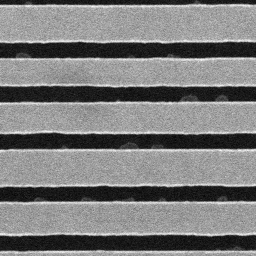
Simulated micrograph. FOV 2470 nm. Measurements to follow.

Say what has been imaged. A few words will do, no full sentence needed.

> lines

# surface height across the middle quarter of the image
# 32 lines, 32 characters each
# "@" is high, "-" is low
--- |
@@@@@@@@@@@@@@@@@@@@@@@@@@@@@@@@
@@@@@@@@@@@@@@@@@@@@@@@@@@@@@@@@
@@@@@@@@@@@@@@@@@@@@@@@@@@@@@@@@
@@@@@@@@@@@@@@@@@@@@@@@@@@@@@@@@
@@@@@@@@@@@@@@@@@@@@@@@@@@@@@@@@
------------@@-@----@--------@@-
--------------------------------
--------------------------------
--------------------------------
--------------------------------
@@@@@@@@@@@@@@@@@@@@@@@@@@@@@@@@
@@@@@@@@@@@@@@@@@@@@@@@@@@@@@@@@
@@@@@@@@@@@@@@@@@@@@@@@@@@@@@@@@
@@@@@@@@@@@@@@@@@@@@@@@@@@@@@@@@
@@@@@@@@@@@@@@@@@@@@@@@@@@@@@@@@
@@@@@@@@@@@@@@@@@@@@@@@@@@@@@@@@
@@@@@@@@@@@@@@@@@@@@@@@@@@@@@@@@
-----@------@-----@-----------@-
--------------------------------
--------------------------------
--------------------------------
@@@@@@@@@@@@@@@@@@@@@@@@@@@@@@@@
@@@@@@@@@@@@@@@@@@@@@@@@@@@@@@@@
@@@@@@@@@@@@@@@@@@@@@@@@@@@@@@@@
@@@@@@@@@@@@@@@@@@@@@@@@@@@@@@@@
@@@@@@@@@@@@@@@@@@@@@@@@@@@@@@@@
@@@@@@@@@@@@@@@@@@@@@@@@@@@@@@@@
@@@@@@@@@@@@@@@@@@@@@@@@@@@@@@@@
@@@@@@@@@@@@@@@@@@@@@@@@@@@@@@@@
@@@@@@@@@@@@@@@@@@@@@@@@@@@@@@@@
-------------------------@@@----
--------------------------------